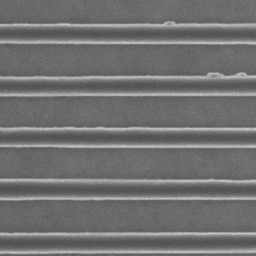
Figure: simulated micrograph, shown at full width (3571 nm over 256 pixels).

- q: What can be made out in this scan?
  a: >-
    lines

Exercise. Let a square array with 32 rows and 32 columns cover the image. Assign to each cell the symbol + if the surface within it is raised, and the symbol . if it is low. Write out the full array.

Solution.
................................
................................
................................
++++++++++++++++++++++++++++++++
++++++++++++++++++++++++++++++++
................................
................................
................................
................................
................................
++++++++++++++++++++++++++++++++
++++++++++++++++++++++++++++++++
................................
................................
................................
................................
++++++++++++++++++++++++++++++++
++++++++++++++++++++++++++++++++
................................
................................
................................
................................
.++.............................
++++++++++++++++++++++++++++++++
++++++++++++++++++++++++++++++++
................................
................................
................................
................................
++++++++++++++++++++++++++++++++
++++++++++++++++++++++++++++++++
++++++++..+++++....+++++........